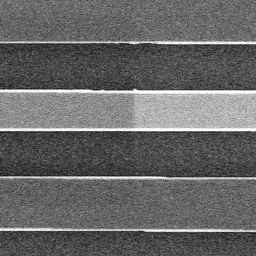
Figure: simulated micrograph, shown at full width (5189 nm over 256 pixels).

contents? lines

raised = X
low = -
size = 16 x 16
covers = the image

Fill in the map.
XXXXXXXXXXXXXXXX
XXXXXXXXXXXXXXXX
XXXXXXXXXXXXXXXX
----------------
----------------
----------------
XXXXXXXXXXXXXXXX
XXXXXXXXXXXXXXXX
----------------
----------------
----------------
XXXXXXXXXXXXXXXX
XXXXXXXXXXXXXXXX
XXXXXXXXXXXXXXXX
----------------
----------------